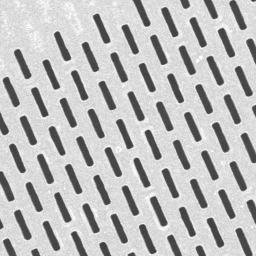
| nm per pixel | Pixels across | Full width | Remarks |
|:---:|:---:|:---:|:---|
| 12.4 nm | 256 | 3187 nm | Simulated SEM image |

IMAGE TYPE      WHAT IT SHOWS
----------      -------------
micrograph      a regular array of holes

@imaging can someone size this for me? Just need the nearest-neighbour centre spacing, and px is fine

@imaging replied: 30